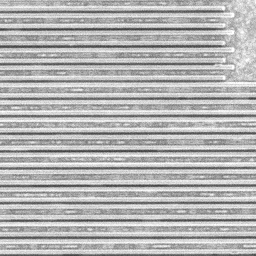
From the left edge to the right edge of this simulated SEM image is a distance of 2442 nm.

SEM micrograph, parallel lines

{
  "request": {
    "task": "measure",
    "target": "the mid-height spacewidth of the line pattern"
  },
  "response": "62 nanometers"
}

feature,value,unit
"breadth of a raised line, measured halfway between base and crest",35.8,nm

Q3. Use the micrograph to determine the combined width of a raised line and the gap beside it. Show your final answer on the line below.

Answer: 82.9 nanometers